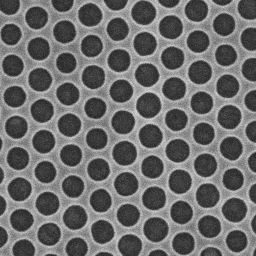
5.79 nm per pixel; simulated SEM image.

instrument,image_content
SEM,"a regular array of holes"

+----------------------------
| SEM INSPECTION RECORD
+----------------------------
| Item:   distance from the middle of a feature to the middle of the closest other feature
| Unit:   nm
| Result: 177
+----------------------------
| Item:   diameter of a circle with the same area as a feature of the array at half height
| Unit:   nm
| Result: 137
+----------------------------